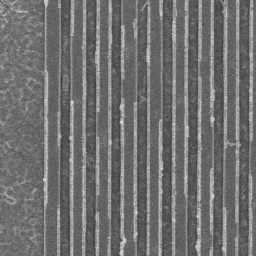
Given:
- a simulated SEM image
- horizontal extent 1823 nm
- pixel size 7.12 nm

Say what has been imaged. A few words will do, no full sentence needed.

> parallel lines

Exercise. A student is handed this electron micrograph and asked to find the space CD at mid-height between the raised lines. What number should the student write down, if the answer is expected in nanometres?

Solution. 69.4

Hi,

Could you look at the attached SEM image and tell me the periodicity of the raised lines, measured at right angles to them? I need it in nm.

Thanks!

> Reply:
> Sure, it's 182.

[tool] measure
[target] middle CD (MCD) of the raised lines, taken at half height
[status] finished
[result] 15.1 px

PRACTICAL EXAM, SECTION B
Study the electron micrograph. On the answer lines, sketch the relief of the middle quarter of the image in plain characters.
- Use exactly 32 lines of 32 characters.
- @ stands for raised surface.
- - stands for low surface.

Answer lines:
--@@@---@@@@--@@@@---@@@---@@@@-
--@@@---@@@@--@@@@---@@@---@@@@-
--@@@---@@@@---@@@---@@@---@@@@-
--@@@---@@@@---@@@---@@@---@@@@-
--@@@---@@@@--@@@@---@@@---@@@@-
--@@@---@@@@--@@@@---@@@---@@@@-
--@@@---@@@@--@@@@---@@@---@@@@-
--@@@---@@@@--@@@@---@@@---@@@@-
--@@@---@@@@--@@@@---@@@---@@@@-
--@@@---@@@@--@@@@---@@@---@@@@-
--@@@---@@@@--@@@@---@@@---@@@@-
--@@@---@@@@--@@@@---@@@---@@@@-
--@@@---@@@@--@@@@---@@@---@@@@-
--@@@---@@@@--@@@@---@@@---@@@@-
--@@@---@@@@--@@@@---@@@---@@@@-
--@@@---@@@@--@@@@---@@@---@@@@-
--@@@---@@@@--@@@@---@@@---@@@@-
--@@@---@@@@--@@@@---@@@---@@@@-
-@@@@---@@@@--@@@@---@@@---@@@@-
--@@@---@@@@--@@@@---@@@---@@@@-
--@@@---@@@@--@@@@---@@@@--@@@@-
--@@@---@@@@--@@@@---@@@@--@@@@-
--@@@@--@@@@--@@@@---@@@---@@@@-
-@@@@---@@@@--@@@@---@@@---@@@@-
-@@@@---@@@@--@@@@---@@@@--@@@@-
--@@@---@@@@--@@@@---@@@@--@@@@-
--@@@---@@@@--@@@@---@@@@--@@@@-
--@@@---@@@@--@@@@---@@@@--@@@@-
--@@@---@@@@--@@@@---@@@---@@@@-
--@@@---@@@@--@@@@---@@@---@@@@-
--@@@---@@@@--@@@@---@@@---@@@@-
--@@@---@@@@--@@@@---@@@@--@@@@-